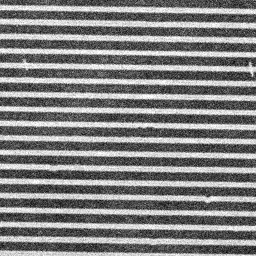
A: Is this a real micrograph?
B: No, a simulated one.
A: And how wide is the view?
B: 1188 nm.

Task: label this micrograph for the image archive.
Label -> parallel lines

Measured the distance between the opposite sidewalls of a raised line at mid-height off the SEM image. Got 0.0238 microns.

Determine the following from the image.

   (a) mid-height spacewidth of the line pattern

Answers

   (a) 44 nm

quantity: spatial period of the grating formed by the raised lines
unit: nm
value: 67